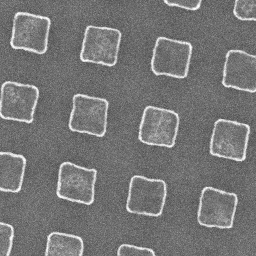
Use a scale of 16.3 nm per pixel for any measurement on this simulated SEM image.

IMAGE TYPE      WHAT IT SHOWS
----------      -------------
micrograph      a regular array of raised bodies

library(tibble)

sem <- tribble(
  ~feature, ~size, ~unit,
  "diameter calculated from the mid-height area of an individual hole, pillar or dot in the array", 649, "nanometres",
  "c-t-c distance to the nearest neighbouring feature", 1.14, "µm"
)